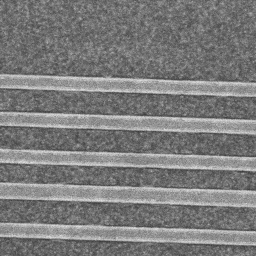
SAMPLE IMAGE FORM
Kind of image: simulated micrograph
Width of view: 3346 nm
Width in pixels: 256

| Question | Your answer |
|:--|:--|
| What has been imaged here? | parallel lines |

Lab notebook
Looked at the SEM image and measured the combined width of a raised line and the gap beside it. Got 0.485 microns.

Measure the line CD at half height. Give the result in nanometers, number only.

152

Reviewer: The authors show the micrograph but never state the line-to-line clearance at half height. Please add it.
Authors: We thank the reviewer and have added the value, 0.338 micrometres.